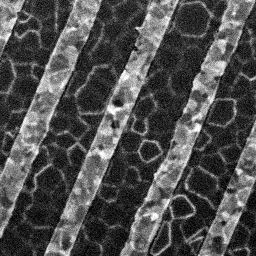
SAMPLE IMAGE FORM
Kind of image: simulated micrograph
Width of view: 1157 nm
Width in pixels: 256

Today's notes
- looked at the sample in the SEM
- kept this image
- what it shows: one or a few lines or trenches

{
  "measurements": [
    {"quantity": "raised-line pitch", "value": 320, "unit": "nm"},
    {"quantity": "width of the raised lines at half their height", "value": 98.2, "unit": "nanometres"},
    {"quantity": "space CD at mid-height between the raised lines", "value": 0.218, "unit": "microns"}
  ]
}